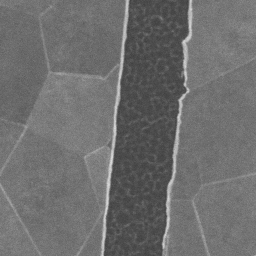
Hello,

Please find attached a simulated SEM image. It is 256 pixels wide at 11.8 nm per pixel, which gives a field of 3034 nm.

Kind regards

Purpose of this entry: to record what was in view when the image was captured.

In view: one or a few lines or trenches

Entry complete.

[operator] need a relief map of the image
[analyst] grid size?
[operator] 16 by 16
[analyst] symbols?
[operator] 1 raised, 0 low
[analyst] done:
1111111100001111
1111111100001111
1111111100001111
1111111100001111
1111111100001111
1111111000001111
1111111000011111
1111111000011111
1111111000011111
1111111000011111
1111111000011111
1111111000011111
1111111000111111
1111111000111111
1111111000111111
1111110000111111